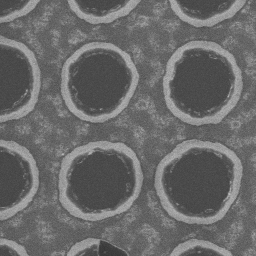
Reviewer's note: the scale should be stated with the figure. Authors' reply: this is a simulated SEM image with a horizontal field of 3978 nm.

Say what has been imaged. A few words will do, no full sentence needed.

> raised bodies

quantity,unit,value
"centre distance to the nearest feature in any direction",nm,1530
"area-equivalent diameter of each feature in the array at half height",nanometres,1170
